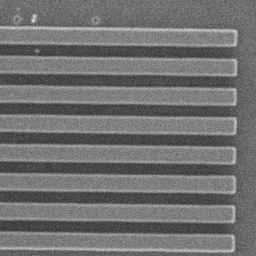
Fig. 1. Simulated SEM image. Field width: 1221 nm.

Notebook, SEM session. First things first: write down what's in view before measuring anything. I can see groups of lines, slits or small figures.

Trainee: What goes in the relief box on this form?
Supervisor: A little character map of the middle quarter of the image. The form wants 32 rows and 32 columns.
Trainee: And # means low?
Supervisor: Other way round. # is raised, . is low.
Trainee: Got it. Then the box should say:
################################
################################
............####....############
................................
................................
................................
################################
################################
################################
################################
................................
................................
................................
################################
################################
################################
################################
................................
................................
................................
######..........................
################################
################################
################################
............####################
................................
................................
................................
################################
################################
################################
################################